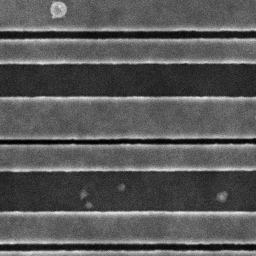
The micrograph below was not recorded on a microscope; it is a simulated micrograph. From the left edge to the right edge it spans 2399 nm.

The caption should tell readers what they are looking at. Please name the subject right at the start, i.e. lines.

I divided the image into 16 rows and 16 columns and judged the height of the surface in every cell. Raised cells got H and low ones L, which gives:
HHHHHHHHHHHHHHHH
HHHHHHHHHHHHHHHH
HHHHHHHHHHHHHHHH
HHHHHHHHHHHHHHHH
LLLLLLLLLLLLLLLL
LLLLLLLLLLLLLLLL
HHHHHHHHHHHHHHHH
HHHHHHHHHHHHHHHH
HHHHHHHHHHHHHHHH
HHHHHHHHHHHHHHHH
HHHHHHHHHHHHHHHH
LLLLLLLLLLLLLLLL
LLLLLLLLLLLLLLLL
HHHHHHHHHHHHHHHH
HHHHHHHHHHHHHHHH
HHHHHHHHHHHHHHHH